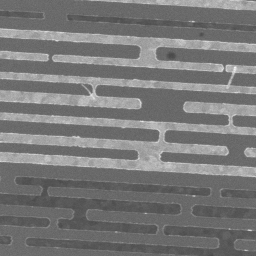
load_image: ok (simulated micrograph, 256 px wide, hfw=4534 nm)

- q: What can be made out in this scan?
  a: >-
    parallel lines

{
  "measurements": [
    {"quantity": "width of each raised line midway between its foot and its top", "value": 155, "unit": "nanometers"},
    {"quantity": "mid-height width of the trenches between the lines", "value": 12.1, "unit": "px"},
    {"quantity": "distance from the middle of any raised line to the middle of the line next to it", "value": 365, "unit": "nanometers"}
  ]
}